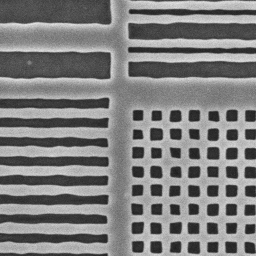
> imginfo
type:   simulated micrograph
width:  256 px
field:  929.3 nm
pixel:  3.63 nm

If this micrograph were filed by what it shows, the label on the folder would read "groups of lines, slits or small figures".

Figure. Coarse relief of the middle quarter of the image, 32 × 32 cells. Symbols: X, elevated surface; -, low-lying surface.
------------XXXX----------------
------------XXXX----------------
------------XXXX----------------
XX----------XXXXXXXXXX--XXXXXXXX
XXXXXXXXXXXXXXXXXXXXXXXXXXXXXXXX
XXXXXXXXXXXXXXXXXXXXXXXXXXXXXXXX
XXXXXXXXXXXXXXXXXXXXXXXXXXXXXXXX
XXXXXXXXXXXXXXXXXXXXXXXXXXXXXXXX
XXXXXXXXXX-XXXXXXXXXXXXXXXXXXXXX
-----------XXXXXXXXXXXXXXXXXXXXX
-----------XXXXXXXXXXXXXXXXXXXXX
XXXXXXXXXXXXXXXXXXXXXXXXXXXXXXXX
XXXXXXXXXXXXXXXXX---XX--XXX---X-
XX----XXXX-XXXXXX---XX--XX----X-
-----------XXXXXXXXXXXXXXXX--XXX
-----------XXXXXXXXXXXXXXXXXXXXX
XXXXXXXXXXXXXXXXXX-XX---XXX--XX-
XXXXXXXXXXXXXXXXX---X----XX---X-
-----XXX--XXXXXXX---X----XX--XXX
-----------XXXXXXXXXXXXXXXXXXXXX
-----------XXXXXXXXXXXXXXXXXXXXX
XXXXXXXXXXXXXXXXX---XX--XXX--XX-
XXXXXXXXXXXXXXXXX---XX--XXX--XX-
-----------XXXXXX--XXX--XXXX-XXX
-----------XXXXXXXXXXXXXXXXXXXXX
-XXX-------XXXXXXXXXXX-XXXXXXXXX
XXXXXXXXXXXXXXXXX---X---XXX--XX-
XXXXXXXXXXXXXXXXX---X----XX---X-
-----------XXXXXXX-XXX--XXXX-XX-
-----------XXXXXXXXXXXXXXXXXXXXX
----X-XXXXXXXXXXX---XX--XXX--XX-
XXXXXXXXXXXXXXXXX---X----X---XX-